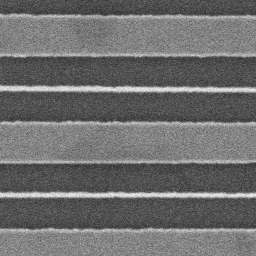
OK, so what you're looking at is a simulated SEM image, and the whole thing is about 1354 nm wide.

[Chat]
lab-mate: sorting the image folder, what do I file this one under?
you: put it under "lines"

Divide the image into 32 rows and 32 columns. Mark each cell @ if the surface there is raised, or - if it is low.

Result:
--------------------------------
--------------------------------
@@@@@@@@@@@@@@@@@@@@@@@@@@@@@@@@
@@@@@@@@@@@@@@@@@@@@@@@@@@@@@@@@
@@@@@@@@@@@@@@@@@@@@@@@@@@@@@@@@
@@@@@@@@@@@@@@@@@@@@@@@@@@@@@@@@
@@@@@@@@@@@@@@@@@@@@@@@@@@@@@@@@
--------------------------------
--------------------------------
--------------------------------
--------------------------------
--------------------------------
--------------------------------
--------------------------------
--------------------------------
@@@@@@@@@@@@@@@@@@@@@@@@@@@@@@@@
@@@@@@@@@@@@@@@@@@@@@@@@@@@@@@@@
@@@@@@@@@@@@@@@@@@@@@@@@@@@@@@@@
@@@@@@@@@@@@@@@@@@@@@@@@@@@@@@@@
@@@@@@@@@@@@@@@@@@@@@@@@@@@@@@@@
--------------------------------
--------------------------------
--------------------------------
--------------------------------
--@-@-@@@@@--@@@-@---@----------
--------------------------------
--------------------------------
--------------------------------
--------------------------------
@@@@@@@@@@@@@@@@@@@@@@@@@@@@@@@@
@@@@@@@@@@@@@@@@@@@@@@@@@@@@@@@@
@@@@@@@@@@@@@@@@@@@@@@@@@@@@@@@@